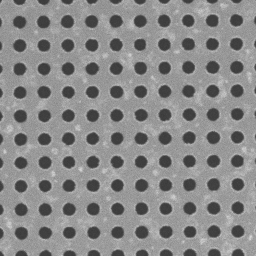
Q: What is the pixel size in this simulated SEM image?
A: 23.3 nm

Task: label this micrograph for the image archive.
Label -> a regular array of holes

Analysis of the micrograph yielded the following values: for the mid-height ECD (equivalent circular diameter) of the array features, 0.302 micrometres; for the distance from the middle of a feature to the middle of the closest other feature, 0.546 microns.